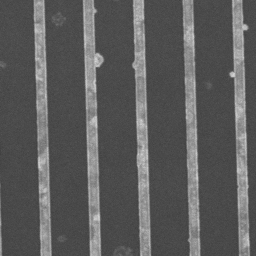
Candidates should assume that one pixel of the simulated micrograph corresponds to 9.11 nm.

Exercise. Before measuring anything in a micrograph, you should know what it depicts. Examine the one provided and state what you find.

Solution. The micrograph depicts parallel lines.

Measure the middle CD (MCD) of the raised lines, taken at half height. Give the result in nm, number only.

85.4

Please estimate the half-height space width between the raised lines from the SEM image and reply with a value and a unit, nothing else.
368 nanometers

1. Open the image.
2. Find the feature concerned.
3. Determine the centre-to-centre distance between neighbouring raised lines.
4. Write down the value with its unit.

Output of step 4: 49.6 pixels